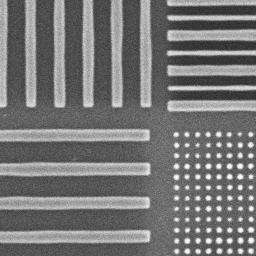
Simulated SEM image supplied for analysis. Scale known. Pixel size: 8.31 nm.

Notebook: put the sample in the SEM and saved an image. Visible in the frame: groups of lines, slits or small figures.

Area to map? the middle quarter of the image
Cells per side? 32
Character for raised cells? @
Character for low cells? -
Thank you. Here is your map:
-----@@-----@@-----@@@----------
-----@@-----@@-----@@@----@@@@@@
-----@@-----@@-----@@@----@@@@@@
-----@@-----@@-----@@@----------
-----@@-----@@-----@@@----------
-----@@-----@@-----@@@----------
-----@@-----@@-----@@@----------
-----@@-----@@-----@@@----------
-----@@-----@@-----@@@----------
-----@@-----@@-----@@@----@@@@@@
-----@@-----@@------@-----@@@@@@
--------------------------@@@@@@
--------------------------------
--------------------------------
--------------------------------
--------------------------------
--------------------------------
@@@@@@@@@@@@@@@@@@@@@---------@-
@@@@@@@@@@@@@@@@@@@@@-----------
--------------------------------
--------------------------------
--------------------------------
--------------------------------
--------------------------------
--------------------------------
@@@@@@@@@@@@@@@@@@@@@---------@-
@@@@@@@@@@@@@@@@@@@@@-----------
@@@@@@@@@@@@@@@@@@@@@-----------
--------------------------------
--------------------------------
--------------------------------
--------------------------------